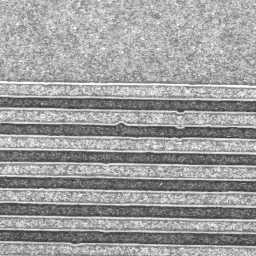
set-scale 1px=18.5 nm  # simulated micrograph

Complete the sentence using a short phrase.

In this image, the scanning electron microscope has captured parallel lines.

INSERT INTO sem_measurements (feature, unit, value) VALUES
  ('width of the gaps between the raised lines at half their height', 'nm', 227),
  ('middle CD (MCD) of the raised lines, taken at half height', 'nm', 259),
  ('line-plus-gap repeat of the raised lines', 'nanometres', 493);